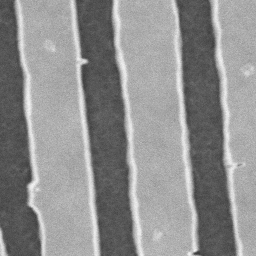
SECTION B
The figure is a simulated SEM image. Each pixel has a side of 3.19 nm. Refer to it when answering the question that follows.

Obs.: one or a few lines or trenches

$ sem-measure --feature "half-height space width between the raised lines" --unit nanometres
121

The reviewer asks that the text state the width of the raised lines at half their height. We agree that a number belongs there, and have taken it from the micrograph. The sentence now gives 58.4 px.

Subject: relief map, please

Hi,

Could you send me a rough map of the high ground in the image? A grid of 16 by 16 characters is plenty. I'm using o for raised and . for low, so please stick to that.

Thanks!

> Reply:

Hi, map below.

.oooo..oooo..ooo
.oooo..oooo..ooo
.oooo..oooo...oo
.oooo..oooo...oo
..ooo...ooo...oo
..ooo...ooo...oo
..ooo...oooo..oo
..ooo...oooo..oo
..ooo...oooo..oo
..oooo..oooo..oo
..oooo..oooo..oo
..oooo..oooo..oo
..oooo..oooo..oo
..oooo..oooo...o
...ooo..oooo...o
...ooo...ooo...o